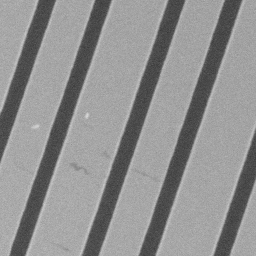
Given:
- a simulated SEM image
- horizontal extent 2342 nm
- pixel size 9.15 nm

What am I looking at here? lines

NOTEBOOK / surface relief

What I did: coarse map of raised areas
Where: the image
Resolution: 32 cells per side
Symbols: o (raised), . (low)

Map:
ooooo..ooooo..ooooooo..ooooo..oo
oooo...oooo...ooooooo..ooooo..oo
oooo..ooooo..ooooooo..ooooo...oo
oooo..ooooo..ooooooo..ooooo..ooo
ooo...oooo...ooooooo..ooooo..ooo
ooo..ooooo..ooooooo..ooooo...ooo
ooo..ooooo..ooooooo..ooooo..oooo
oo..ooooo...oooooo...ooooo..oooo
oo..ooooo..ooooooo..ooooo...oooo
oo..ooooo..ooooooo..ooooo..ooooo
o..ooooo...oooooo...ooooo..ooooo
o..ooooo..ooooooo..ooooo..oooooo
o..ooooo..ooooooo..ooooo..oooooo
..ooooo..ooooooo...ooooo..oooooo
..ooooo..ooooooo..ooooo..ooooooo
..ooooo..ooooooo..ooooo..ooooooo
.ooooo..ooooooo...oooo...ooooooo
.ooooo..ooooooo..ooooo..ooooooo.
.ooooo..ooooooo..ooooo..ooooooo.
ooooo..ooooooo...oooo...ooooooo.
ooooo..ooooooo..ooooo..ooooooo..
ooooo..ooooooo..ooooo..ooooooo..
oooo..ooooooo...ooooo..ooooooo..
oooo..ooooooo..ooooo..ooooooo...
oooo..ooooooo..ooooo..ooooooo..o
ooo..ooooooo...ooooo..ooooooo..o
ooo..ooooooo..ooooo..ooooooo...o
ooo..ooooooo..ooooo..ooooooo..oo
oo..ooooooo...ooooo..ooooooo..oo
oo..ooooooo..ooooo..ooooooo...oo
oo..ooooooo..ooooo..ooooooo..ooo
o..ooooooo...oooo...ooooooo..ooo